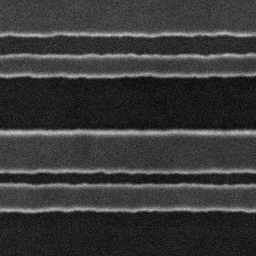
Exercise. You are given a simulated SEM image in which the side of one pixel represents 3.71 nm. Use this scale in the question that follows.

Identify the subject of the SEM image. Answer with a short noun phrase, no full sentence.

lines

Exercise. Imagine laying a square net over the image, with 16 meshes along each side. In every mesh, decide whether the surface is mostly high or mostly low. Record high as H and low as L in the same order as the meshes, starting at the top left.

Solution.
HHHHHHHHHHHHHHHH
HHHHHHHHHHHHHHHH
HHHHHHHHHHHHHHHH
HHHHHHHHHHHHHHHH
HHHHHHHHHHHHHHHH
LLLLLLLLLLLLLLLL
LLLLLLLLLLLLLLLL
LLLLLLLLLLLLLLLL
HHHHHHHHHHHHHHHH
HHHHHHHHHHHHHHHH
HHHHHHHHHHHHHHHH
HHHHHHHHHHHHHHHH
HHHHHHHHHHHHHHHH
LLLLLLLLLLLLLLLL
LLLLLLLLLLLLLLLL
LLLLLLLLLLLLLLLL